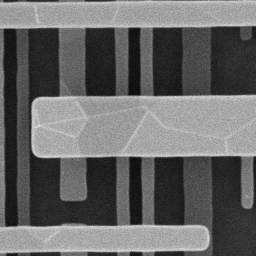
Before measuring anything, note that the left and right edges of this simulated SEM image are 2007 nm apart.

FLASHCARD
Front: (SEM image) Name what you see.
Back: wiring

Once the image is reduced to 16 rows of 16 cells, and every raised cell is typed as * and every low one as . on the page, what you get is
****************
****************
................
................
................
................
..**************
..**************
..**************
..**************
................
................
................
................
*************...
*************...